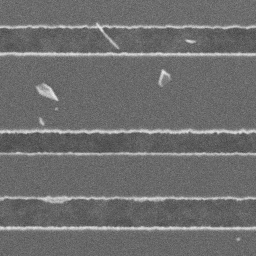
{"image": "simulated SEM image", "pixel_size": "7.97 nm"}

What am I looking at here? lines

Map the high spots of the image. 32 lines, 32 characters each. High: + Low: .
++++++++++++++++++++++++++++++++
++++++++++++++++++++++++++++++++
++++++++++++++++++++++++++++++++
.+..........+...+...........+.+.
................................
................................
................................
++++++++++++++++++++++++++++++++
++++++++++++++++++++++++++++++++
++++++++++++++++++++++++++++++++
++++++++++++++++++++++++++++++++
++++++++++++++++++++++++++++++++
++++++++++++++++++++++++++++++++
++++++++++++++++++++++++++++++++
++++++++++++++++++++++++++++++++
++++++++++++++++++++++++++++++++
++++..+++++++++++.++++++++++++++
................................
................................
++++++++++++++++++++++++++++++++
++++++++++++++++++++++++++++++++
++++++++++++++++++++++++++++++++
++++++++++++++++++++++++++++++++
++++++++++++++++++++++++++++++++
++++++++++++++++++++++++++++++++
................................
................................
................................
++++++++++++++++++++++++++++++++
++++++++++++++++++++++++++++++++
++++++++++++++++++++++++++++++++
++++++++++++++++++++++++++++++++